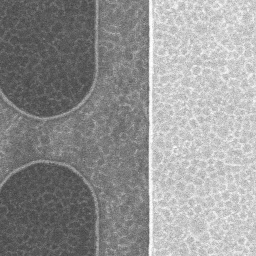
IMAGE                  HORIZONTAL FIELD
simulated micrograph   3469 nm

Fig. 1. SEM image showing one or a few lines or trenches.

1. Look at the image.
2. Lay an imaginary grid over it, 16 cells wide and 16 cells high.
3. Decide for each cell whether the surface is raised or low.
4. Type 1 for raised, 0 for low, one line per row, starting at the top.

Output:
1111110001111111
1111110001111111
1111110001111111
1111110001111111
1111110001111111
1111110001111111
0111100001111111
0000000001111111
0000000001111111
0000000001111111
0111000001111111
1111100001111111
1111110001111111
1111110001111111
1111110001111111
1111110001111111